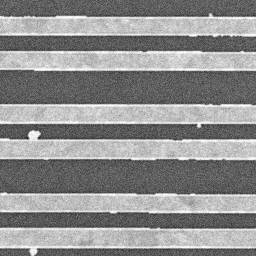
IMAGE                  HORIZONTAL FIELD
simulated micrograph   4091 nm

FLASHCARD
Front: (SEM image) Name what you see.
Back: lines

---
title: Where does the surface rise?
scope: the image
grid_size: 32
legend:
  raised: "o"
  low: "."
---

................................
................................
oooooooooooooooooooooooooooooooo
oooooooooooooooooooooooooooooooo
................................
................................
oooooooooooooooooo..oooo........
oooooooooooooooooooooooooooooooo
oooooooooooooooooooooooooooooooo
................................
................................
................................
................................
oooooooooooooooooooooooooooooooo
oooooooooooooooooooooooooooooooo
................................
................................
...oo...........................
oooooooooooooooooooooooooooooooo
oooooooooooooooooooooooooooooooo
................................
................................
................................
................................
oooooooooooooooooooooooooooooooo
oooooooooooooooooooooooooooooooo
...................o.o.ooooooooo
................................
................................
oooooooooooooooooooooooooooooooo
oooooooooooooooooooooooooooooooo
................................